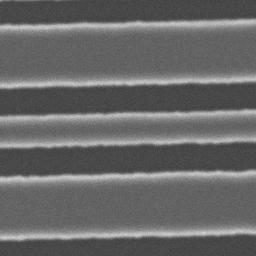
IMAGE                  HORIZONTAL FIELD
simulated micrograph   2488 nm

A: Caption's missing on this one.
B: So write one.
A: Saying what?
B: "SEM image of lines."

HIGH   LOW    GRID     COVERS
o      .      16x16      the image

................
.....o.ooooooooo
oooooooooooooooo
oooooooooooooooo
oooooooooooooooo
................
................
oooooooooooooooo
oooooooooooooooo
................
................
oooooooooooooooo
oooooooooooooooo
oooooooooooooooo
oooooooooooooooo
................